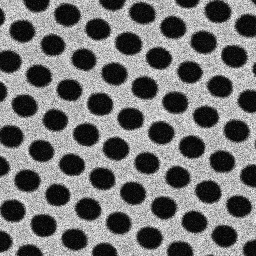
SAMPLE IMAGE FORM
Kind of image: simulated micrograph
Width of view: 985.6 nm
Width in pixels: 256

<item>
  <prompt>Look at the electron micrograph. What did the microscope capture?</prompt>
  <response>a regular array of holes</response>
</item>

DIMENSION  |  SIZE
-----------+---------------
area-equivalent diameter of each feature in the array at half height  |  0.096 micrometres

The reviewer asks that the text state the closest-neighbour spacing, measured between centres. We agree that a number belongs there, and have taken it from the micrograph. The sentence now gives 128 nm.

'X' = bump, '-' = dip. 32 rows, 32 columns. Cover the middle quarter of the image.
XX------XX-----XXXXXX-----XXX---
XXXX---XX-------XXXXXXXXXXXX----
XXXXXXXXX-------XXXXXXXXXXXX----
XXXXXXXXXX------XX----XXXXXXX---
----XXXXXX-----XX------XXXXXXX--
----XXXXXXXXXXXXX------XXXXXXXXX
-----XXXXXXXXXXXX-------XXXXXXXX
-----XX----XXXXXX------XXX----XX
----XX------XXXXXX----XXX------X
XXXXXX------XXXXXXXXXXXX-------X
XXXXXX------XXXXXXXXXXXXX------X
XXXXXX------XX-----XXXXXX-----XX
-XXXXXX----XX-------XXXXXXXX-XXX
-XXXXXXXXXXXX-------XXXXXXXXXXXX
-XXXXXXXXXXXX-------XXX---XXXXXX
-XX-----XXXXXX------XX-----XXXXX
XX-------XXXXXXX-XXXX-------XXXX
XX-------XXXXXXXXXXXX-------XXXX
XX-------XXX---XXXXXX------XXX--
XXX-----XX------XXXXXX-----XX---
XXXXX--XXX------XXXXXXXXXXXXX---
XXXXXXXXXX-------XXXXXXXXXXXX---
X--XXXXXXX------XXX----XXXXXX---
-----XXXXXX----XXX------XXXXXXX-
-----XXXXXXXXXXXX-------XXXXXXXX
-----XXXXXXXXXXXXX------XXXX-XXX
-----XX-----XXXXXX-----XXX-----X
----XX-------XXXXXXX--XXX------X
XXXXXX-------XXXXXXXXXXXX-------
XXXXXXX------XXX--XXXXXXX------X
XXXXXXX-----XX------XXXXXX----XX
-XXXXXXXXX-XXX------XXXXXXXXXXXX